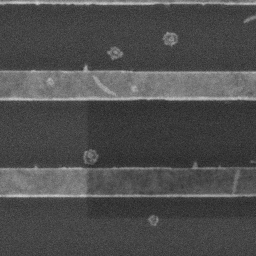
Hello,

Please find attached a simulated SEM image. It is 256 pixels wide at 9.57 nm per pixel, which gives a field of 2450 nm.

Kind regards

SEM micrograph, lines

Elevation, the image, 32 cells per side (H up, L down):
LLLLLLLLLLLLLLHLHHHHLLLLLLLLHHHH
LLLLLLLLLLLLLLLLLLLLLLLLLLLLLLLL
LLLLLLLLLLLLLLLLLLLLLLLLLLLLLLLL
LLLLLLLLLLLLLLLLLLLLLLLLLLLLLLLL
LLLLLLLLLLLLLLLLLLLLLLLLLLLLLLLL
LLLLLLLLLLLLLLLLLLLLLLLLLLLLLLLL
LLLLLLLLLLLLLLLLLLLLLLLLLLLLLLLL
LLLLLLLLLLLLLLLLLLLLLLLLLLLLLLLL
LLLLLLLLLLLLLLLLLLLLLLLLLLLLLLLL
HHHHHHHHHHHHHHHHHHHHHHHHHHHHHHHH
HHHHHHHHHHHHHHHHHHHHHHHHHHHHHHHH
HHHHHHHHHHHHHHHHHHHHHHHHHHHHHHHH
LLLLLLLLLLLLLLLLLLLLLLLLLLLLLLLL
LLLLLLLLLLLLLLLLLLLLLLLLLLLLLLLL
LLLLLLLLLLLLLLLLLLLLLLLLLLLLLLLL
LLLLLLLLLLLLLLLLLLLLLLLLLLLLLLLL
LLLLLLLLLLLLLLLLLLLLLLLLLLLLLLLL
LLLLLLLLLLLLLLLLLLLLLLLLLLLLLLLL
LLLLLLLLLLLLLLLLLLLLLLLLLLLLLLLL
LLLLLLLLLLLLLLLLLLLLLLLLLLLLLLLL
LLLLLLLLLLLLLLLLLLLLLLLLLLLLLLLL
HHHHHHHHHHHHHHHHHHHHHHHHHHHHHHHH
HHHHHHHHHHHHHHHHHHHHHHHHHHHHHHHH
HHHHHHHHHHHHHHHHHHHHHHHHHHHHHHHH
HHHHHHHHHHHHHHHHHHHHHHHHHHHHHHLL
LLLLLLLLLLLLLLLLLLLLLLLLLLLLLLLL
LLLLLLLLLLLLLLLLLLLLLLLLLLLLLLLL
LLLLLLLLLLLLLLLLLLLLLLLLLLLLLLLL
LLLLLLLLLLLLLLLLLLLLLLLLLLLLLLLL
LLLLLLLLLLLLLLLLLLLLLLLLLLLLLLLL
LLLLLLLLLLLLLLLLLLLLLLLLLLLLLLLL
LLLLLLLLLLLLLLLLLLLLLLLLLLLLLLLL